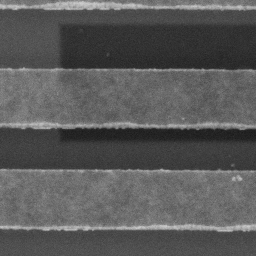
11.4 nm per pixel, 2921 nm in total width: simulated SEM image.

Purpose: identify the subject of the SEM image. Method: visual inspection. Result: lines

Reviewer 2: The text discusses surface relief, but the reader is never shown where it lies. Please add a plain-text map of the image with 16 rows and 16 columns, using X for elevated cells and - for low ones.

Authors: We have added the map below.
---------XX-XXXX
----------------
----------------
----------------
XXXXXXXXXXXXXXXX
XXXXXXXXXXXXXXXX
XXXXXXXXXXXXXXXX
XXXXXXXXXXXXXXXX
----------------
----------------
----------------
XXXXXXXXXXXXXXXX
XXXXXXXXXXXXXXXX
XXXXXXXXXXXXXXXX
----------------
----------------